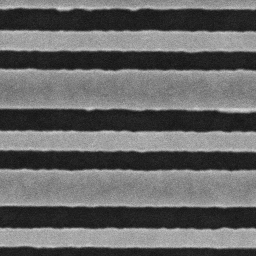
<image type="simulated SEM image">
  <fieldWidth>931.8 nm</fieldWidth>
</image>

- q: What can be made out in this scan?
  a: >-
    lines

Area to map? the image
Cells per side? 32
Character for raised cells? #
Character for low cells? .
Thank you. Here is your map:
################################
................................
................................
................................
################################
################################
................................
................................
................................
################################
################################
################################
################################
################################
................................
................................
.####.####..####......#.........
################################
################################
................................
................................
################################
################################
################################
################################
################################
................................
................................
................................
################################
################################
................................